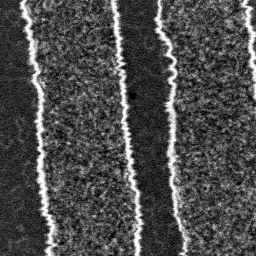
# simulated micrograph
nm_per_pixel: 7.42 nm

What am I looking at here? one or a few lines or trenches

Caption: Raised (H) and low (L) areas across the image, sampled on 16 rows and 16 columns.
LHHHHHHLLLHHHHHL
LLHHHHHLLLHHHHHH
LLHHHHHLLLHHHHHH
LLHHHHHLLLLHHHHH
LLHHHHHHLLLHHHHH
LLHHHHHHLLLHHHHH
LLLHHHHHLLLHHHHH
LLHHHHHHLLLHHHHH
LLHHHHHHLLLHHHHH
LLLHHHHHLLLHHHHH
LLLHHHHHLLLHHHHH
LLLHHHHHLLLHHHHH
LLLHHHHHHLLHHHHH
LLLHHHHHHLLHHHHH
LLLHHHHHHLLHHHHH
LLLHHHHHHLLLHHHH